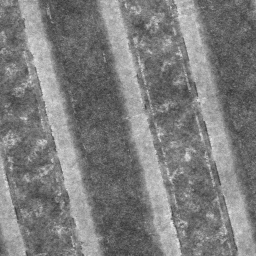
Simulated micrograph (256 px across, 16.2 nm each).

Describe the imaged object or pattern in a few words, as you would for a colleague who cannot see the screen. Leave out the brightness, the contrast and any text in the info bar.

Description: one or a few lines or trenches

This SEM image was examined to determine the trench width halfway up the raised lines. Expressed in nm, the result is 1280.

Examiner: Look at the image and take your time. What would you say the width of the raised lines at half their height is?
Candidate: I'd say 1170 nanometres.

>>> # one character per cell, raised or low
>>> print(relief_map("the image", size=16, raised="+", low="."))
++.....+++++....
++.....+++++....
++.....+++++....
+++.....++++....
+++.....+++++...
+++.....+++++...
+++.....+++++...
++++.....++++...
++++.....+++++..
++++.....+++++..
++++.....+++++..
+++++.....++++..
+++++.....+++++.
+++++.....+++++.
.++++.....+++++.
.+++++.....++++.